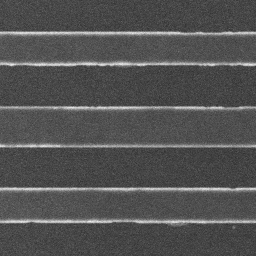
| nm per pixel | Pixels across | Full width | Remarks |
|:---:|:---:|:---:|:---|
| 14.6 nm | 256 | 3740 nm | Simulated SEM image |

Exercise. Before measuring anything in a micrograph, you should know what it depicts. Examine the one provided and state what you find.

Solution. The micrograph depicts lines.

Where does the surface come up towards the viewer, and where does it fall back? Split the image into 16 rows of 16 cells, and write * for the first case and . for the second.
................
................
****************
****************
................
................
................
****************
****************
................
................
................
****************
****************
................
................